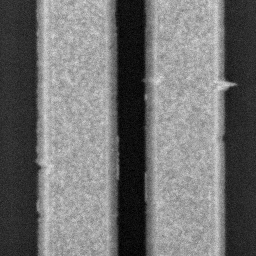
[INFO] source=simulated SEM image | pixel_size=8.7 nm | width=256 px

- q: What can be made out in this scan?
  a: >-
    one or a few lines or trenches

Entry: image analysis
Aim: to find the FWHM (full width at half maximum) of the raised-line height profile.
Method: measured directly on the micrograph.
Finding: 0.54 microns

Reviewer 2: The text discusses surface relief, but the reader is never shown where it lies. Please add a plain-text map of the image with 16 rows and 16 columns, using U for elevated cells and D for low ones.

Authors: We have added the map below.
DDDUUUUDDDUUUDDD
DDDUUUUDDDUUUDDD
DDDUUUUDDDUUUDDD
DDDUUUUDDDUUUDDD
DDDUUUUDDDUUUUDD
DDDUUUUDDDUUUUDD
DDDUUUUDDDUUUDDD
DDDUUUUDDDUUUDDD
DDDUUUUDDDUUUDDD
DDDUUUUDDDUUUDDD
DDDUUUUDDDUUUDDD
DDDUUUUDDDUUUDDD
DDDUUUUDDDUUUUDD
DDDUUUUDDDUUUUDD
DDDUUUUDDDUUUUDD
DDDUUUUDDDUUUUDD